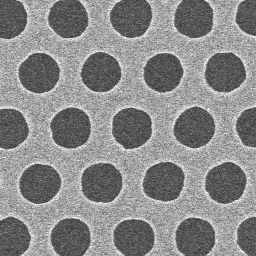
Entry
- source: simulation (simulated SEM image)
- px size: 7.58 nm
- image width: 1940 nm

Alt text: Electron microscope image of a regular array of holes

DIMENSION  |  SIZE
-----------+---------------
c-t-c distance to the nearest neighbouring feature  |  468 nanometers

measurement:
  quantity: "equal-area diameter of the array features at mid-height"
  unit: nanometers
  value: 311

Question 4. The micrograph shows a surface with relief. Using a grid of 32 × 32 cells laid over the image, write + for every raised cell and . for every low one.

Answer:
...++++...+++++....+++....++++..
...+++.....+++.....+++.....+++..
...+++.....+++.....+++.....++...
...+++.....+++.....+++.....+++..
..+++++...+++++...+++++..+++++++
++++++++++++++++++++++++++++++++
++++++++++++++++++++++++++++++++
+++....++++....++++...++++....++
++.....+++.....+++.....+++.....+
++.....+++.....+++.....+++.....+
+++....++++....+++....++++....++
++++..++++++.+++++++.++++++..+++
++++++++++++++++++++++++++++++++
++++++++..++++++++++++++.+++++++
...++++....+++.....+++....++++..
...+++.....+++.....+++.....++...
....++.....+++.....+++.....+++..
...++++....+++....++++....++++..
..++++++.+++++++.+++++++++++++++
++++++++++++++++++++++++++++++++
++++++++++++..++++++..+++++..+++
+++....+++.....+++.....+++....++
++......++.....+++.....+++.....+
++......++.....+++.....+++.....+
+++....++++....+++....++++....++
++++++++++++++++++++++++++++++++
++++++++++++++++++++++++++++++++
...+++++..++++++..+++++..++++++.
...++++....+++.....+++.....+++..
....++.....+++.....+++.....+++..
....++.....+++.....+++.....+++..
...++++....++++....++++...+++++.